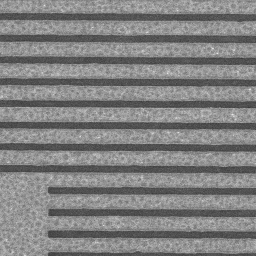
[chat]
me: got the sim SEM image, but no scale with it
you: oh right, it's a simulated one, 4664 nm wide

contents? parallel lines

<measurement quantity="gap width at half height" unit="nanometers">141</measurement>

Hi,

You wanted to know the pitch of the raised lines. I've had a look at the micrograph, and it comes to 396 nanometres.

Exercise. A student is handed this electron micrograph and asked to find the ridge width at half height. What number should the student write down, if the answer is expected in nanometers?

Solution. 266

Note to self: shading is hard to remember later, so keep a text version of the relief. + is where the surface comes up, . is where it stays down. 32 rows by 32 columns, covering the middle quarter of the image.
++++++++++++++++++++++++++++++++
++++++++++++++++++++++++++++++++
++++++++++++++++++++++++++++++++
+.+++.+++++++.....++++.+++++++.+
................................
++..............................
++++++++++++++++++++++++++++++++
++++++++++++++++++++++++++++++++
++++++++++++++++++++++++++++++++
................................
................................
++++++++++++++++++++++++++++++++
++++++++++++++++++++++++++++++++
++++++++++++++++++++++++++++++++
..........................++++++
................................
+++++++++++++++++++++++++++++++.
++++++++++++++++++++++++++++++++
++++++++++++++++++++++++++++++++
++++++++++++++++++++++++++++++++
................................
................................
++++++++++++++++++++++++++++++++
++++++++++++++++++++++++++++++++
++++++++++++++++++++++++++++++++
................................
................................
+++++++++++++++++++++++++.......
++++++++++++++++++++++++++++++++
++++++++++++++++++++++++++++++++
++++++++++++++++++++++++++++++++
................................